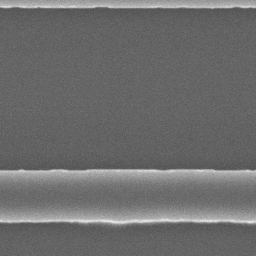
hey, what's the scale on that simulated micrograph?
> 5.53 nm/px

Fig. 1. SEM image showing lines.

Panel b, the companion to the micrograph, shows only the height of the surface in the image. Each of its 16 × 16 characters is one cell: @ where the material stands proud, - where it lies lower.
----------------
----------------
----------------
----------------
----------------
----------------
----------------
----------------
----------------
----------------
----------------
@@@@@@@@@@@@@@@@
@@@@@@@@@@@@@@@@
@@@@@@@@@@@@@@@@
----------------
----------------